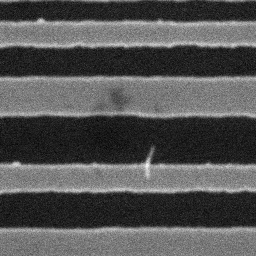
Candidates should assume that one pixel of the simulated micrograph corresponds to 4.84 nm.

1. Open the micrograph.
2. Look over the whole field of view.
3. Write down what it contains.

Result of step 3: lines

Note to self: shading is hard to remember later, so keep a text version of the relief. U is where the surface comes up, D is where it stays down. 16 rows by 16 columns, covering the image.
DDDDDDDDDDDDDDDD
UUUUUUUUUUUUUUUU
UUUUUUUUUUUUUUUU
DDDDDDDDDDDDDDDD
DDDDDDDDDDDDDDDD
UUUUUUUUUUUUUUUU
UUUUUUUUUUUUUUUU
DDDDDDDDDDDDDDDD
DDDDDDDDDDDDDDDD
DDDDDDDDDDDDDDDD
UUUUUUUUUUUUUUUU
UUUUUUUUUUUUUUUU
DDDDDDDDDDDDDDDD
DDDDDDDDDDDDDDDD
UUUUUUUUUUUUUUUU
UUUUUUUUUUUUUUUU